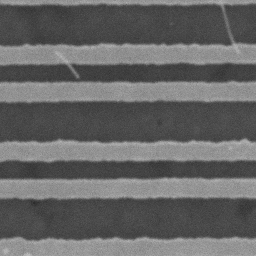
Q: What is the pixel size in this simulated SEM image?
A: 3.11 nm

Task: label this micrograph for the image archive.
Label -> lines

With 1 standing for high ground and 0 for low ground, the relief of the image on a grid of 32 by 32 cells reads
00111001110000000010010100011000
00000000000000000000000000000000
00000000000000000000000000000000
00000000000000000000000000000000
00000000000000000000000000000000
00000000000000000000000000000100
11111111111111111111111111111111
11111111111111111111111111111111
00000000000000000000000000000000
00000000000000000000000000000000
11111111111111111111111111111111
11111111111111111111111111111111
11111111111111111111111111111111
00000000000000000000000000000000
00000000000000000000000000000000
00000000000000000000000000000000
00000000000000000000000000000000
00000000000000000000000000000000
11111111111111111111111111111111
11111111111111111111111111111111
00000000000000000000000000000000
00000000000000000000000000000000
00000000000000111101111111111111
11111111111111111111111111111111
11111111111111111111111111111111
00000000000000000000000000000000
00000000000000000000000000000000
00000000000000000000000000000000
00000000000000000000000000000000
00000000000000000000000000000000
11111111111111111111111111111111
11111111111111111111111111111111